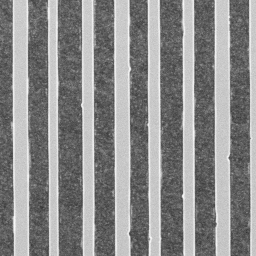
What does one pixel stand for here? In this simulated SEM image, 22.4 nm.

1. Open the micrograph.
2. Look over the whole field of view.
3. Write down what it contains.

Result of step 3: parallel lines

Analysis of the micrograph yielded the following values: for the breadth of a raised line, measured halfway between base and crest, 238 nanometres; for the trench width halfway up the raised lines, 490 nm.